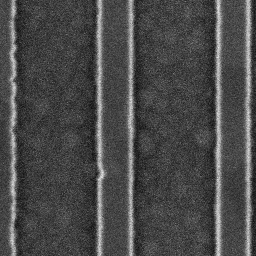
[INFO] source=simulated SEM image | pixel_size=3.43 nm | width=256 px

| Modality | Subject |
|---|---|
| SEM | one or a few lines or trenches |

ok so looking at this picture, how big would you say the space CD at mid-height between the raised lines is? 0.297 µm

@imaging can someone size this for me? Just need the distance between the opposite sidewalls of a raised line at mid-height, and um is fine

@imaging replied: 0.106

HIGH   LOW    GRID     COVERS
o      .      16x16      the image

o.....oo......oo
o.....oo......oo
o.....oo......oo
o.....oo......oo
o.....oo......oo
o.....oo......oo
o.....oo......oo
o.....oo......oo
o.....oo......oo
o.....oo......oo
o.....oo......oo
o.....oo......oo
o.....oo......oo
o.....oo......oo
o.....oo......oo
o.....oo......oo